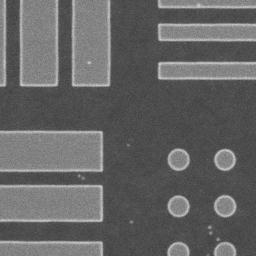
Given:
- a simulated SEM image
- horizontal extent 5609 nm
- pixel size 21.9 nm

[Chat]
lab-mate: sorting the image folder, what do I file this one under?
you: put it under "groups of lines, slits or small figures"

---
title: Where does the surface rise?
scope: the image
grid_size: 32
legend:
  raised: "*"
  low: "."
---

*..****..*****......************
*..****..*****..................
*..****..*****..................
*..****..*****......************
*..****..*****......************
*..****..*****..................
*..****..*****..................
*..****..*****..................
*..****..*****......************
*..****..*****......************
...****..*****..................
................................
................................
................................
................................
................................
******.***......................
*************...................
*************...................
*************........***...**...
*************........**....**...
................................
................................
*************...................
*************...................
*************........***...**...
*************........**....**...
************....................
................................
................................
*************.........*.....*...
*************........***...**...